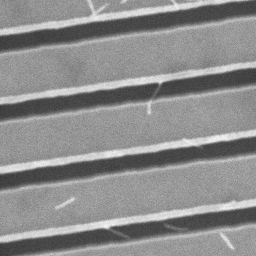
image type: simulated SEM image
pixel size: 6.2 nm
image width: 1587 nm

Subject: lines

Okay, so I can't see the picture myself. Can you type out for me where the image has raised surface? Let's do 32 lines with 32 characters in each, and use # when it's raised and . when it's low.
############################....
####################............
##############...............###
#######...............##########
...............#################
.........#######################
.###############################
################################
###############################.
#########################.......
##################..............
###########................#####
####................############
............####################
......##########################
################################
################################
#############################...
######################..........
###############................#
########...............#########
##..............################
..........######################
..##############################
################################
################################
##########################......
####################............
############.................###
######...............###########
...............#################
........########################